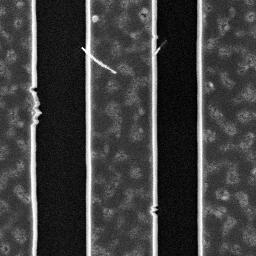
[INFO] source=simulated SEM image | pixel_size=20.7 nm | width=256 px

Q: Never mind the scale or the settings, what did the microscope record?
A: one or a few lines or trenches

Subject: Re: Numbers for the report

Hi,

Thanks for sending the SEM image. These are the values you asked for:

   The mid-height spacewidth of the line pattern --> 1.01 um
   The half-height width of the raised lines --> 1400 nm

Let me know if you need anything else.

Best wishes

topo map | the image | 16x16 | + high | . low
++...+++++..++++
++...+++++..++++
++...+++++..++++
++...+++++..++++
++....++++..++++
++....++++..++++
++....++++..++++
++....++++..++++
++....++++...+++
++....++++...+++
++....++++...+++
++....++++...+++
++....++++...+++
++....++++...+++
++....++++...+++
++....++++...+++